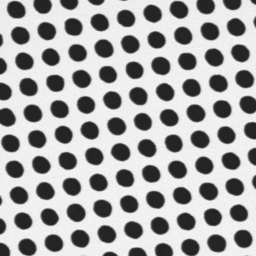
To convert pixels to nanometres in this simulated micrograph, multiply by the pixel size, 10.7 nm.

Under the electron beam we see a regular array of holes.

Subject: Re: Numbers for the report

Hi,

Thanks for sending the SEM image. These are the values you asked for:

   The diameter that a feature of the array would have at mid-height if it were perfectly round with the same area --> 18.1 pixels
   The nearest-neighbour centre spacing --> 0.279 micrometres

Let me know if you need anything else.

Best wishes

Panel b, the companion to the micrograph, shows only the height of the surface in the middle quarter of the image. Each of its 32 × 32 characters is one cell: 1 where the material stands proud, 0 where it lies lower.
11111111111111100000110000011000
11100111100001100000110000111100
11000011100001110000111000111111
11000001100001111001111111111111
11000001110011111111111111111100
11100011111111111111111000011100
11111111111111111000111000011100
11111111110000110000011000001100
11110001110000110000011100011111
11100000110000111000011111111111
01100000110000111111111111111110
01110001111111111111111110011110
01111111111111111100011100001110
11111111111100111100001100000110
11111101111000011000001100001111
11110000111000011100001111011111
00110000011000011110011111111111
00110000011100011111111111111111
00111000111111111111111110000111
01111111111111111110001110000011
11111111111100001100000110000011
11111100011100001100000111000111
00111000001100000110000111111111
00011000001110001111111111111111
00011100011111111111111111100111
00011111111111111111100111000011
11111111111111001111000011000001
11111111011110000110000011000011
11111100001110000111000011110011
00001100000110000111100111111111
00001110000111000111111111111111
00001111001111111111111111100001